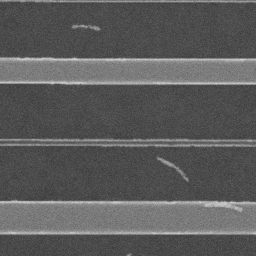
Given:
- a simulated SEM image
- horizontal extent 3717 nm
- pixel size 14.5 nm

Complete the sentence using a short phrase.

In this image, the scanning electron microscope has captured lines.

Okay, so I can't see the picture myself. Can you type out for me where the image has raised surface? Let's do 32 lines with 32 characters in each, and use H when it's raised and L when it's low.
LLLLLLLLLLLLLLLLLLLLLLLLLLLLLLLL
LLLLLLLLLLLLLLLLLLLLLLLLLLLLLLLL
LLLLLLLLLLLLLLLLLLLLLLLLLLLLLLLL
LLLLLLLLLLLLLLLLLLLLLLLLLLLLLLLL
LLLLLLLLLLLLLLLLLLLLLLLLLLLLLLLL
LLLLLLLLLLLLLLLLLLLLLLLLLLLLLLLL
LLLLLLLLLLLLLLLLLLLLLLLLLLLLLLLL
HHHHHHHHHHHHHHHHHHHHHHHHHHHHHHHH
HHHHHHHHHHHHHHHHHHHHHHHHHHHHHHHH
HHHHHHHHHHHHHHHHHHHHHHHHHHHHHHHH
LLLLLLLLLLLLLLLLLLLLLLLLLLLLLLLL
LLLLLLLLLLLLLLLLLLLLLLLLLLLLLLLL
LLLLLLLLLLLLLLLLLLLLLLLLLLLLLLLL
LLLLLLLLLLLLLLLLLLLLLLLLLLLLLLLL
LLLLLLLLLLLLLLLLLLLLLLLLLLLLLLLL
LLLLLLLLLLLLLLLLLLLLLLLLLLLLLLLL
LLLLLLLLLLLLLLLLLLLLLLLLLLLLLLLL
HHHHHHLLLLLLLLLLLLLLLLLLLLLLLLLL
LLLLLLLLLLLLLLLLLLLLLLLLLLLLLLLL
LLLLLLLLLLLLLLLLLLLLLLLLLLLLLLLL
LLLLLLLLLLLLLLLLLLLLLLLLLLLLLLLL
LLLLLLLLLLLLLLLLLLLLLLLLLLLLLLLL
LLLLLLLLLLLLLLLLLLLLLLLLLLLLLLLL
LLLLLLLLLLLLLLLLLLLLLLLLLLLLLLLL
LLLLLLLLLLLLLLLLLLLLLLLLLLLLLLLL
HHHHHHHHHHHHHHHHHHHHHHHHHHHHHHHH
HHHHHHHHHHHHHHHHHHHHHHHHHHHHHHHH
HHHHHHHHHHHHHHHHHHHHHHHHHHHHHHHH
HHHHHHHHHHHHHHHHHHHHHHHHHHHHHHHH
LLLLLLLLLLLLLLLLLLLLLLLLLLLLLLLL
LLLLLLLLLLLLLLLLLLLLLLLLLLLLLLLL
LLLLLLLLLLLLLLLLLLLLLLLLLLLLLLLL